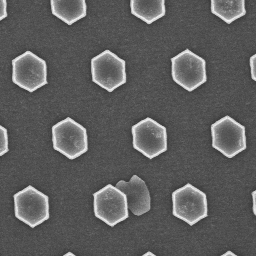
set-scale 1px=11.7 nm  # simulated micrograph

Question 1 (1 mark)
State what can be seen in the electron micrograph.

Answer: a regular array of raised bodies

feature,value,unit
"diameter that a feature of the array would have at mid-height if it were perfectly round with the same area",35.1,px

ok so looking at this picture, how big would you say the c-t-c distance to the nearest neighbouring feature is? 910 nm